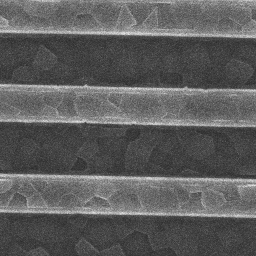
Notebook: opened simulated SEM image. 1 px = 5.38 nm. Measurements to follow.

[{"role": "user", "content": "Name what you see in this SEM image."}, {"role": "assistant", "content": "one or a few lines or trenches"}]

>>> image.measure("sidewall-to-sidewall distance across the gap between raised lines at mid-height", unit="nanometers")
286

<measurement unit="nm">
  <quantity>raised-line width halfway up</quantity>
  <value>195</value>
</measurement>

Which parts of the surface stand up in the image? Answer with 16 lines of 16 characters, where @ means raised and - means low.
@@@@@@@@@@@@@@@@
@@@@@@@@@@@@@@@@
----------------
----------------
----------------
@@@@@@@@--------
@@@@@@@@@@@@@@@@
@@@@@@@@@@@@@@@@
----------------
----------------
----------------
@@@@@@@@@@@@@@@@
@@@@@@@@@@@@@@@@
--------------@@
----------------
----------------